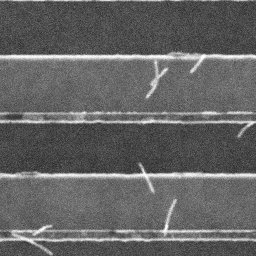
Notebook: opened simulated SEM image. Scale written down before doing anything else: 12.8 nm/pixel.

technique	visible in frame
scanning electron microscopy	lines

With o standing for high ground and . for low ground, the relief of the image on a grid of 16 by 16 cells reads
................
................
................
oo.oo.oooooooooo
oooooooooooooooo
oooooooooooooooo
oooooooooooooooo
oooooooooooooooo
................
................
................
oooooooooooooooo
oooooooooooooooo
oooooooooooooooo
oooooooooooooooo
................